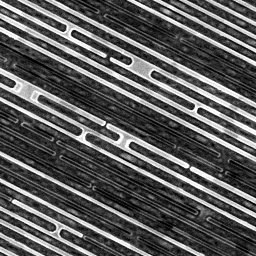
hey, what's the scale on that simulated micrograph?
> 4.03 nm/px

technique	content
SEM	parallel lines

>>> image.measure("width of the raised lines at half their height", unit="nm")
13.5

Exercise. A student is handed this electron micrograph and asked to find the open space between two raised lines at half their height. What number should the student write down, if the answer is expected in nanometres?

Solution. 34.5